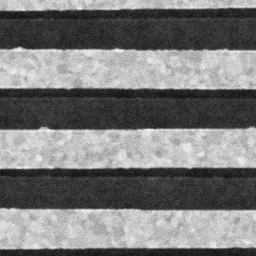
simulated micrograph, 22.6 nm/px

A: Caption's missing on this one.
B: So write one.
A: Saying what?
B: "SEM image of lines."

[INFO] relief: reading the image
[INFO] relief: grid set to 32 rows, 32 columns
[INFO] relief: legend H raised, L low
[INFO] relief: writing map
HHHHHHHHHHHHHHHHHHHHHHHHHHHHHHHH
LLLLLLLLLLLLLLLLLLLLLLLLLLLLLLLL
LLLLLLLLLLLLLLLLLLLLLLLLLLLLLLLL
LLLLLLLLLLLLLLLLLLLLLLLLLLLLLLLL
LLLLLLLLLLLLLLLLLLLLLLLLLLLLLLLL
LLLLLLLLLLLLLLLLLLLLLLLLLLLLLLLL
HHHHHHHHHHHHHHHHHHHHHHHHHHHHHHHH
HHHHHHHHHHHHHHHHHHHHHHHHHHHHHHHH
HHHHHHHHHHHHHHHHHHHHHHHHHHHHHHHH
HHHHHHHHHHHHHHHHHHHHHHHHHHHHHHHH
HHHHHHHHHHHHHHHHHHHHHHHHHHHHHHHH
LLLLLLLLLLLLLLLLLLLLLLLLLLLLLLLL
LLLLLLLLLLLLLLLLLLLLLLLLLLLLLLLL
LLLLLLLLLLLLLLLLLLLLLLLLLLLLLLLL
LLLLLLLLLLLLLLLLLLLLLLLLLLLLLLLL
LLLLLLLLLLLLLLLLLLLLLLLLLLLLLLLL
HHHHHHHHHHHHHHHHHHHHHHHHHHHHHHHH
HHHHHHHHHHHHHHHHHHHHHHHHHHHHHHHH
HHHHHHHHHHHHHHHHHHHHHHHHHHHHHHHH
HHHHHHHHHHHHHHHHHHHHHHHHHHHHHHHH
HHHHHHHHHHHHHHHHHHHHHHHHHHHHHHHH
LLLLLLLLLLLLLLLLLLLLLLLLLLLLLLLL
LLLLLLLLLLLLLLLLLLLLLLLLLLLLLLLL
LLLLLLLLLLLLLLLLLLLLLLLLLLLLLLLL
LLLLLLLLLLLLLLLLLLLLLLLLLLLLLLLL
LLLLLLLLLLLLLLLLLLLLLLLLLLLLLLLL
HHHHHHHHHHHHHHHHHHHHHHHHHHHHHHHH
HHHHHHHHHHHHHHHHHHHHHHHHHHHHHHHH
HHHHHHHHHHHHHHHHHHHHHHHHHHHHHHHH
HHHHHHHHHHHHHHHHHHHHHHHHHHHHHHHH
HHHHHHHHHHHHHHHHHHHHHHHHHHHHHHHH
LLLLLLLLLLLLLLLLLLLLLLLLLLLLLLLL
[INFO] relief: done